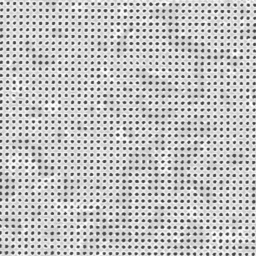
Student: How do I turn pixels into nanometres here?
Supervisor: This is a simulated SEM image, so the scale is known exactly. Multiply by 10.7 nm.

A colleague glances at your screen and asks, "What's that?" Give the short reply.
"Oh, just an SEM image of a regular array of holes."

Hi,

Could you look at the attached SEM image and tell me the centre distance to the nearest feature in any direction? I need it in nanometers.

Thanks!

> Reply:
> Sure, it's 65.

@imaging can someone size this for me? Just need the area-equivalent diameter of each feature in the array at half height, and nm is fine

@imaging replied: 41.7